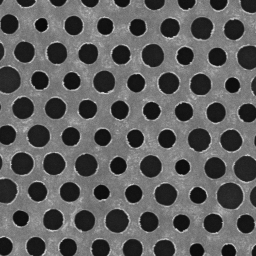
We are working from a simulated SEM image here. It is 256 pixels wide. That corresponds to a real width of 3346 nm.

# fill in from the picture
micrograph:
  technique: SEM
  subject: a regular array of holes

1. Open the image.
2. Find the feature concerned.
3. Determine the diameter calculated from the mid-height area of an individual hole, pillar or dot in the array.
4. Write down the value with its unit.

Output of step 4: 252 nanometres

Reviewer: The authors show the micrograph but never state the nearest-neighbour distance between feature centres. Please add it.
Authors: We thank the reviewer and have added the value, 415 nm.